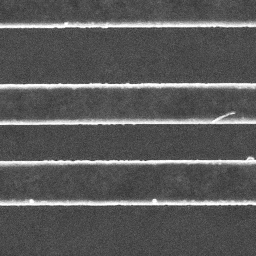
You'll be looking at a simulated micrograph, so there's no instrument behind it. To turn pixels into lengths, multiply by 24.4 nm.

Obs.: lines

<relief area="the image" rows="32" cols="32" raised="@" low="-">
@@@@@@@@@@@@@@@@@@@@@@@@@@@@@@@@
@@@@@@@@@@@@@@@@@@@@@@@@@@@@@@@@
@@@@@@@@@@@@@@@@@@@@@@@@@@@@@@@@
--------------------------------
--------------------------------
--------------------------------
--------------------------------
--------------------------------
--------------------------------
--------------------------------
--------------------------------
@@@@@@@@@@@@@@@@@@@@@@@@@@@@@@@@
@@@@@@@@@@@@@@@@@@@@@@@@@@@@@@@@
@@@@@@@@@@@@@@@@@@@@@@@@@@@@@@@@
@@@@@@@@@@@@@@@@@@@@@@@@@@@@@@@@
--------------------------------
--------------------------------
--------------------------------
--------------------------------
--------------------------------
@@@@@@@@@@@@@@@@@@@@@@@@@@@@@@@@
@@@@@@@@@@@@@@@@@@@@@@@@@@@@@@@@
@@@@@@@@@@@@@@@@@@@@@@@@@@@@@@@@
@@@@@@@@@@@@@@@@@@@@@@@@@@@@@@@@
@@@@@@@@@@@@@@@@@@@@@@@@@@@@@@@@
--------------------------------
--------------------------------
--------------------------------
--------------------------------
--------------------------------
--------------------------------
--------------------------------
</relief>